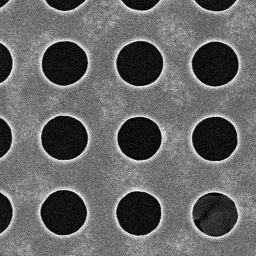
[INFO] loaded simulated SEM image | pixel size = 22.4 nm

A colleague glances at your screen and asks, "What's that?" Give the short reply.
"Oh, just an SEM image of a regular array of holes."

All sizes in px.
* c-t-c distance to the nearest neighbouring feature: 75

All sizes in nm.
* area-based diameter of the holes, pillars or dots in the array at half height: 1020